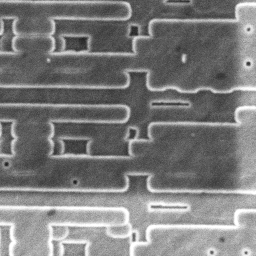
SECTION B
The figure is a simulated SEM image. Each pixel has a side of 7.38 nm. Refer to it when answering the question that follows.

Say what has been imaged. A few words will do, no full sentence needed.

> wiring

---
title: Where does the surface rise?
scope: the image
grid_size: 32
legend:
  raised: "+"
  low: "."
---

++++++++++++++++................
++++++++++++++++..............++
..+++++............+++++++++++++
..+++++............+++++++++++++
..+++++...........++++++++++++++
..+++++..........+++++++++++++++
.++++++..........+++++++++++++++
++++++++++++++++++++++++++++++++
++++++++++++++++++++++++++++++++
++++++++++++++++..++++++++++++++
++++++++++++++++..++++++++++++++
.......................+...++...
................................
++++++++++++++++..............++
++++++++++++++++..............++
.++++++............++++++++..+++
..+++++............+++++++++++++
..++++...........+++++++++++++++
..+++++.........++++++++++++++++
+++++++++.......++++++++++++++++
++++++++++++++++++++++++++++++++
++++++++++++++++++++++++++++++++
++++++++++++++++..++++++++++++++
++++++++++++++++...+++++++++++++
................................
................................
++++++++++++++++..............++
++++++++++++++++.............+++
.++++++......+++...+++++++++++++
.+++++........++..++++++++++++++
.+++++...........+++++++++++++++
.+++++..........++++++++++++++++